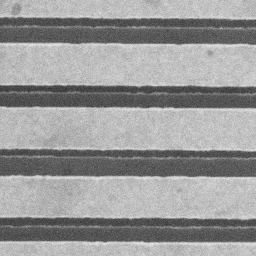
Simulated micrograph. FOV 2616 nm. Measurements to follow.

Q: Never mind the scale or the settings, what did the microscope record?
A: lines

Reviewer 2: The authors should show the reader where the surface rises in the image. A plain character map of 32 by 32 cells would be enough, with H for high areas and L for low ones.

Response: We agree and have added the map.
HHHHHHHHHHHHHHHHHHHHHHHHHHHHHHHH
HHHHHHHHHHHHHHHHHHHHHHHHHHHHHHHH
LLLLLLLLLLLLLLLLLLLLLLLLLLLLLLLL
LLLLLLLLLLLLLLLLLLLLLLLLLLLLLLLL
LLLLLLLLLLLLLLLLLLLLLLLLLLLLLLLL
HHHHHHHHHLHHHHHLLLLLLLLLLLLLLLLL
HHHHHHHHHHHHHHHHHHHHHHHHHHHHHHHH
HHHHHHHHHHHHHHHHHHHHHHHHHHHHHHHH
HHHHHHHHHHHHHHHHHHHHHHHHHHHHHHHH
HHHHHHHHHHHHHHHHHHHHHHHHHHHHHHHH
HHHHHHHHHHHHHHHHHHHHHHHHHHHHHHHH
LLLLLLLLLLLLLLLLLLLLLLLLLLLLLLLL
LLLLLLLLLLLLLLLLLLLLLLLLLLLLLLLL
HHHHHHHHHHHHHHHHLLLHLLLLLLLLLLLL
HHHHHHHHHHHHHHHHHHHHHHHHHHHHHHHH
HHHHHHHHHHHHHHHHHHHHHHHHHHHHHHHH
HHHHHHHHHHHHHHHHHHHHHHHHHHHHHHHH
HHHHHHHHHHHHHHHHHHHHHHHHHHHHHHHH
LHLLHLHHHHHHHHHHHHHHHHHHHHHHHHHH
LLLLLLLLLLLLLLLLLLLLLLLLLLLLLLLL
LLLLLLLLLLLLLLLLLLLLLLLLLLLLLLLL
LLLLLLLLLLLLLLLLLLLLLLLLLLLLLLLL
HHHHHHHHHHHHHHHHHHHHHHHHHHHHHHHH
HHHHHHHHHHHHHHHHHHHHHHHHHHHHHHHH
HHHHHHHHHHHHHHHHHHHHHHHHHHHHHHHH
HHHHHHHHHHHHHHHHHHHHHHHHHHHHHHHH
HHHHHHHHHHHHHHHHHHHHHHHHHHHHHHHH
LLLLLLLLLLLLLLLLLLLLLLLLLLLLLLLL
LLLLLLLLLLLLLLLLLLLLLLLLLLLLLLLL
LLLLLLLLLLLLLLLLLLLLLLLLLLLLLLLL
HHHHHHHHHHHHHHHHHHHHHHHHHHHHHHHH
HHHHHHHHHHHHHHHHHHHHHHHHHHHHHHHH